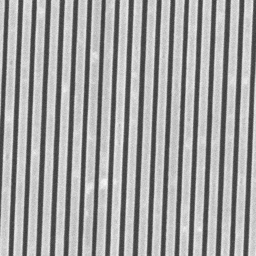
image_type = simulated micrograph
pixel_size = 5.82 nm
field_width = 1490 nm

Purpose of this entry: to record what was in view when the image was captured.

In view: parallel lines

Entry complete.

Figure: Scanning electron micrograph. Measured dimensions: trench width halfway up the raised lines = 31.3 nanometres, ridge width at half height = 53.1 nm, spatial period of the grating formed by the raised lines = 80.4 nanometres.